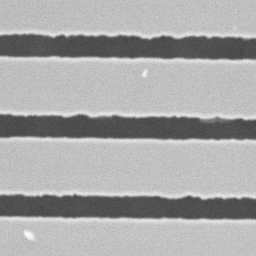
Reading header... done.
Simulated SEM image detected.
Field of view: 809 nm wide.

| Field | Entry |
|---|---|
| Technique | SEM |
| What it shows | lines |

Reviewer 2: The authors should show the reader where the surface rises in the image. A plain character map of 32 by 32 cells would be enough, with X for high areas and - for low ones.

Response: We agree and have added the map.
XXXXXXXXXXXXXXXXXXXXXXXXXXXXXXXX
XXXXXXXXXXXXXXXXXXXXXXXXXXXXXXXX
XXXXXXXXXXXXXXXXXXXXXXXXXXXXXXXX
XXXXXXXXXXXXXXXXXXXXXXXXXXXXXXXX
------X----X-X---XXX-XXXXXXXXXXX
--------------------------------
--------------------------------
XXXXXXXXXXXXXXXXXXXXXXXXXXXXXXXX
XXXXXXXXXXXXXXXXXXXXXXXXXXXXXXXX
XXXXXXXXXXXXXXXXXXXXXXXXXXXXXXXX
XXXXXXXXXXXXXXXXXXXXXXXXXXXXXXXX
XXXXXXXXXXXXXXXXXXXXXXXXXXXXXXXX
XXXXXXXXXXXXXXXXXXXXXXXXXXXXXXXX
XXXXXXXXXXXXXXXXXXXXXXXXXXXXXXXX
--------X--X---XXXXXXXXXXXXXXXXX
--------------------------------
--------------------------------
XXXXXXXXXXXXXXXXXXXX-X-XX-X-XXX-
XXXXXXXXXXXXXXXXXXXXXXXXXXXXXXXX
XXXXXXXXXXXXXXXXXXXXXXXXXXXXXXXX
XXXXXXXXXXXXXXXXXXXXXXXXXXXXXXXX
XXXXXXXXXXXXXXXXXXXXXXXXXXXXXXXX
XXXXXXXXXXXXXXXXXXXXXXXXXXXXXXXX
XXXXXXXXXXXXXXXXXXXXXXXXXXXXXXXX
-------------X--X---XXX-XXXXXXXX
--------------------------------
--------------------------------
XXXXXXXXXXXXXXXXXXXXXXX--X--X-X-
XXXXXXXXXXXXXXXXXXXXXXXXXXXXXXXX
XXXXXXXXXXXXXXXXXXXXXXXXXXXXXXXX
XXXXXXXXXXXXXXXXXXXXXXXXXXXXXXXX
XXXXXXXXXXXXXXXXXXXXXXXXXXXXXXXX